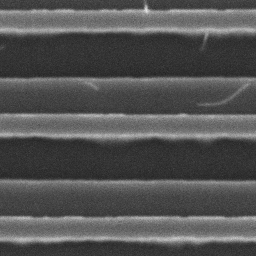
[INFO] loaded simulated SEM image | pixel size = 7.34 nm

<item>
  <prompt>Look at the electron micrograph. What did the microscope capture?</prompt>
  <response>lines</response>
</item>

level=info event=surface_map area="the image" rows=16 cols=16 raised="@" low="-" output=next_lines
@@@@@@@@@@@@@@@@
@@@@@@@@@@@@@@@@
----------------
----------------
----------------
@@@@@@@@@@@@@@@@
@@@@@@@@@@@@@@@@
@@@@@@@@@@@@@@@@
----------------
----------------
----------------
@@@@@@@@@@@@@@@@
@@@@@@@@@@@@@@@@
@@@@@@@@@@@@@@@@
@@@@@@@@@@@@@@@@
----------------